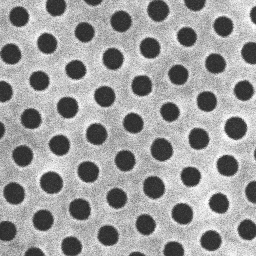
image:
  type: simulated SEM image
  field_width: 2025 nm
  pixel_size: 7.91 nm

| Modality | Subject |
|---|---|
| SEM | a regular array of holes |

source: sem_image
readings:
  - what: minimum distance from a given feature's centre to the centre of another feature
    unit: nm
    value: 302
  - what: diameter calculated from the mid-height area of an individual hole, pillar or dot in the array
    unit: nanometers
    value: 171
